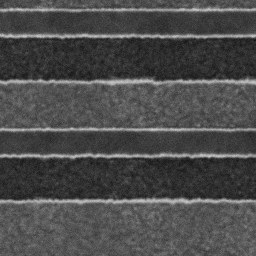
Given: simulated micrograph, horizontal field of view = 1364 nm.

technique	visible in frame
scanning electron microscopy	lines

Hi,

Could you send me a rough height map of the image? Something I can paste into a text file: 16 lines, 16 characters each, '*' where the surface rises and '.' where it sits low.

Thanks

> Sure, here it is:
****************
****************
................
................
................
****************
****************
****************
****************
****************
................
................
................
****************
****************
****************